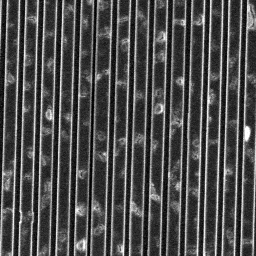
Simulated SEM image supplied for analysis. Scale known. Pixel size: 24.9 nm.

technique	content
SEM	parallel lines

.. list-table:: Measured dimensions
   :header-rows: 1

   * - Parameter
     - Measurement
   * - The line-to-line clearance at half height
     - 137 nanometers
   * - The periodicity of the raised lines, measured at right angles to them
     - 459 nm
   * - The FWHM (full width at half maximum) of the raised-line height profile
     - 323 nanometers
